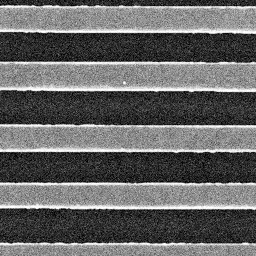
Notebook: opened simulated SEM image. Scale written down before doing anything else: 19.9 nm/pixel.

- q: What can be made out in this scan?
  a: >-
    lines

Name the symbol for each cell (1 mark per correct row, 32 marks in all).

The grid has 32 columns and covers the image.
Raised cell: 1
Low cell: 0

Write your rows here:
00000000000000000000000000000000
11111111111111111111111111111111
11111111111111111111111111111111
11111111111111111111111111111111
00000000000000000000000000000000
00000000000000000000000000000000
00000000000000000000000000000000
00000000000000000000000000000000
11111111111111111111111111111111
11111111111111111111111111111111
11111111111111111111111111111111
00000000000000000000000000000000
00000000000000000000000000000000
00000000000000000000000000000000
00000000000000000000000000000000
00000000000000000000000000000000
11111111111111111111111111111111
11111111111111111111111111111111
11111111111111111111111111111111
00000000000000000000000000000000
00000000000000000000000000000000
00000000000000000000000000000000
00000000000000000000000000000000
11111111111111111111111111111111
11111111111111111111111111111111
11111111111111111111111111111111
00000000000000000000000000000000
00000000000000000000000000000000
00000000000000000000000000000000
00000000000000000000000000000000
11111111011111111110111001000010
11111111111111111111111111111111